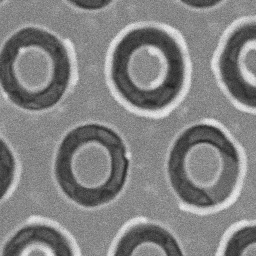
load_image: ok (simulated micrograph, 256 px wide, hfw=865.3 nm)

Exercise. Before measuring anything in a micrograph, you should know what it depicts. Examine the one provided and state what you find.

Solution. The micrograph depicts ring-shaped grooves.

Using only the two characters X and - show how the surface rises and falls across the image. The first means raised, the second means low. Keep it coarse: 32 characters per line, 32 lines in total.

XXXXXXXXX-----XXXXXXXXX----XXXXX
XXXXXXXXXXXXXXXXXXXXXXXXXXXXXXXX
XXXXXXXXXXXXXXXXXXXXXXXXXXXXXXXX
XXX--XXXXXXXXXXXXX-XXXXXXXXXXX--
XX-----XXXXXXXXX-----XXXXXXXX---
X-------XXXXXXX-------XXXXXX---X
--XXXX--XXXXXX---XXX---XXXXX--XX
--XXXX---XXXXX--XXXXX--XXXXX--XX
--XXXXX--XXXXX--XXXXX--XXXX---XX
--XXXX---XXXXX--XXXXX--XXXXX--XX
---XXX---XXXXX---XXX---XXXXX---X
X-------XXXXXXX-------XXXXXXX---
X------XXXXXXXXX------XXXXXXXX--
XXX---XXXXXXXXXXXX--XXXXXXXXXXXX
XXXXXXXXXXXXXXXXXXXXXXXXXXXXXXXX
XXXXXXXXXXXXXXXXXXXXXXXXXXXXXXXX
XXXXXXXXX-----XXXXXXXXX-----XXXX
XXXXXXXX-------XXXXXXX-------XXX
-XXXXXX---XXX---XXXXXX--XXX--XXX
--XXXXX--XXXXX--XXXXX--XXXXX--XX
--XXXXX--XXXXX--XXXXX--XXXXX--XX
--XXXXX--XXXXX--XXXXX--XXXXX--XX
--XXXXX---XXX---XXXXX---XXX---XX
-XXXXXXX---X---XXXXXXX-------XXX
XXXXXXXX------XXXXXXXX-------XXX
XXXXXXXXXX---XXXXXXXXXXX---XXXXX
XXXXXXXXXXXXXXXXXXXXXXXXXXXXXXXX
XXXXXXXXXXXXXXXXXXXXXXXXXXXXXXXX
XXX----XXXXXXXXXX---XXXXXXXXXX--
XX------XXXXXXX-------XXXXXXX---
X---X----XXXXXX--XXX--XXXXXX---X
---XXXX--XXXXX---XXXX--XXXXX--XX